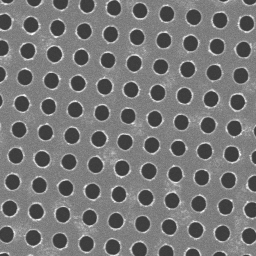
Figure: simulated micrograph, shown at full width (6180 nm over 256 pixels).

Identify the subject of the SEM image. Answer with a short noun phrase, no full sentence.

a regular array of holes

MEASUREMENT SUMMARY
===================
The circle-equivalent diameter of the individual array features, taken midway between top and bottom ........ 367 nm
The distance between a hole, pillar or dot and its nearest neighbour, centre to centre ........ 26.3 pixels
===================